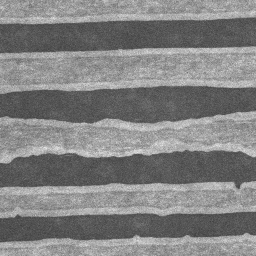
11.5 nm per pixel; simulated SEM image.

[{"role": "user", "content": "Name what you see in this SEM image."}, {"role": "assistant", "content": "one or a few lines or trenches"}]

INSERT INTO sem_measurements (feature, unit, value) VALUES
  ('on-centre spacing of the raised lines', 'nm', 752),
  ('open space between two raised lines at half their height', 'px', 33.9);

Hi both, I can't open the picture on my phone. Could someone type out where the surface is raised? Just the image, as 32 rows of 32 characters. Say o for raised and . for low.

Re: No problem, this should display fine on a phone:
oooooooooooooooooooooooooooooooo
oooooooooooooooooooooooooooooooo
.oooooooo.......................
................................
................................
................................
.................ooooooooooooooo
oooooooooooooooooooooooooooooooo
oooooooooooooooooooooooooooooooo
oooooooooooooooooooooooooooooooo
ooooooooooooooooo...........ooo.
................................
................................
................................
.............................ooo
oooooooooooooo.........ooooooooo
oooooooooooooooooooooooooooooooo
oooooooooooooooooooooooooooooooo
ooooooooooooooooooo.....ooo..ooo
o..........ooooo................
................................
................................
................................
..............ooooooooooooooo.oo
oooooooooooooooooooooooooooooooo
oooooooooooooooooooooooooooooooo
ooooooooo.......................
................................
................................
................................
....oooooooooooooooooooooooooooo
oooooooooooooooooooooooooooooooo